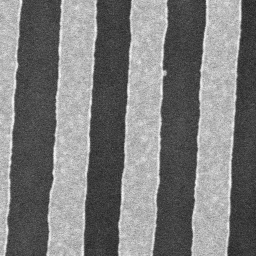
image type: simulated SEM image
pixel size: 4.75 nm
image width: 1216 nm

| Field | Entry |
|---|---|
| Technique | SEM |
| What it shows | lines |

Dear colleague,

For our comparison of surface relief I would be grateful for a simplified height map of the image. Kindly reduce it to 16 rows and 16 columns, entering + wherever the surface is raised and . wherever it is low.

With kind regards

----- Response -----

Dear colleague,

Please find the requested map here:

+...++..++...++.
+...++..++...++.
+...++..++...++.
+...++..++...++.
+...++..++...++.
+...++..++..+++.
+...++..++..+++.
+...++..++..+++.
+..+++..++..+++.
+..+++..++..++..
+..++...++..++..
+..++...++..++..
+..++...++..++..
...++..+++..++..
...++..+++..++..
...++..+++..++..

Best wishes